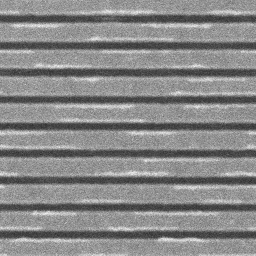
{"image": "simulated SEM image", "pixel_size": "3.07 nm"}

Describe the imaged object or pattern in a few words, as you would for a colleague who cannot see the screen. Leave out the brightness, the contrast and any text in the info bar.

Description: parallel lines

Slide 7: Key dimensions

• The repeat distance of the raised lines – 0.0829 um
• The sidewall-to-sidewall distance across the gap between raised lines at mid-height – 27.3 nm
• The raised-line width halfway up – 0.0546 microns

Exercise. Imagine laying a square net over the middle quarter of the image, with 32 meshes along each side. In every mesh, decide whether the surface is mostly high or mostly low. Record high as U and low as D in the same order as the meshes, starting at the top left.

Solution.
UUUUUUUUUUUUUUUUUUUUUUUUUUUUUUUU
DDDDDDDDDDDDDDDDDDDDDDDDDDDDDDDD
DDDDDDDDDDDDDDDDDDDDDDDDDDDDDDDD
UUUUUUUUUUUUUUUUUUUDDDDUUUUUUUUU
UUUUUUUUUUUUUUUUUUUUUUUUUUUUUUUU
UUUUUUUUUUUUUUUUUUUUUUUUUUUUUUUU
UUUUUUUUUUUUUUUUUUUUUUUUUUUUUUUU
UUUUUUUUUUUUUUUUUUUUUUUUUUUUUUUU
DDDDDDDDDDDDDDDDDDDDDDDDDDDDDDDD
DDDDDDDDDDDDDDDDDDDDDDDDDDDDDDDD
UUUUUUUUUUUUUUUUUUUUUUUUUUUUUUUU
UUUUUUUUUUUUUUUUUUUUUUUUUUUUUUUU
UUUUUUUUUUUUUUUUUUUUUUUUUUUUUUUU
UUUUUUUUUUUUUUUUUUUUUUUUUUUUUUUU
UUUUUUUUUDUUDUUDDDDUUDUUUUUUDDUU
DDDDDDDDDDDDDDDDDDDDDDDDDDDDDDDD
DDDDDDDDDDDDDDDDDDDDDDDDDDDDDDDD
UUUUUUUUUUUUUUUUUUUUUUUUUUUUUUUU
UUUUUUUUUUUUUUUUUUUUUUUUUUUUUUUU
UUUUUUUUUUUUUUUUUUUUUUUUUUUUUUUU
UUUUUUUUUUUUUUUUUUUUUUUUUUUUUUUU
DDDDDDDDDDDDDDDDDDDDDDDDDDDDDDDD
DDDDDDDDDDDDDDDDDDDDDDDDDDDDDDDD
DDDDDDDDDDDDDDDDDDDDDDDDDDDDDDDD
UUUUUUUUUUUUUUUUUUUUUUUUUUUUUUUU
UUUUUUUUUUUUUUUUUUUUUUUUUUUUUUUU
UUUUUUUUUUUUUUUUUUUUUUUUUUUUUUUU
UUUUUUUUUUUUUUUUUUUUUUUUUUUUUUUU
DDDDDDDDDDDDDDDDDDDDDDDDDDDDDDDD
DDDDDDDDDDDDDDDDDDDDDDDDDDDDDDDD
DDUUUUDUUDUDUDDDDDDDUDUUUUDDDDUU
UUUUUUUUUUUUUUUUUUUUUUUUUUUUUUUU